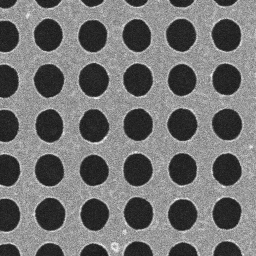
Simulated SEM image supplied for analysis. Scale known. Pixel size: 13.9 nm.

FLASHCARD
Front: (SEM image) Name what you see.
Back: a regular array of holes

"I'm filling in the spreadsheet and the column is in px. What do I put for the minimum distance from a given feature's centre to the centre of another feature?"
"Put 44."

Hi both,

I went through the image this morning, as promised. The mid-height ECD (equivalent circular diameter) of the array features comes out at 429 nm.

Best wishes